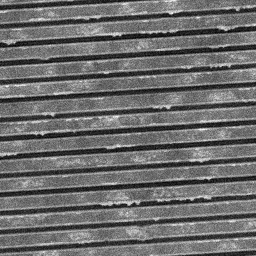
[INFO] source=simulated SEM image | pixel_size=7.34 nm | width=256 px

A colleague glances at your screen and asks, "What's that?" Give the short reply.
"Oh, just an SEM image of parallel lines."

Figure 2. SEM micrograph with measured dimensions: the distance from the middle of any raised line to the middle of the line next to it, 137 nm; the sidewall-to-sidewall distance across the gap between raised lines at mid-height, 40.3 nm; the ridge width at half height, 94.3 nm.